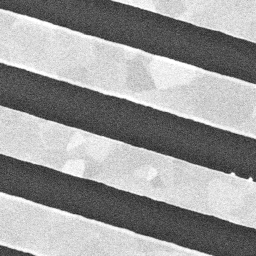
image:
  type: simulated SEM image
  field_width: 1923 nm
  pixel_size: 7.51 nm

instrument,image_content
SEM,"lines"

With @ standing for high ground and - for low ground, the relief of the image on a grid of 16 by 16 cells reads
---------@@@@@@@
@@@---------@@@@
@@@@@@---------@
@@@@@@@@@@------
--@@@@@@@@@@@---
-----@@@@@@@@@@@
---------@@@@@@@
@@@---------@@@@
@@@@@@---------@
@@@@@@@@@@------
---@@@@@@@@@@---
-------@@@@@@@@@
@@--------@@@@@@
@@@@@--------@@@
@@@@@@@@--------
-@@@@@@@@@@@----